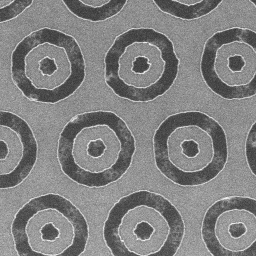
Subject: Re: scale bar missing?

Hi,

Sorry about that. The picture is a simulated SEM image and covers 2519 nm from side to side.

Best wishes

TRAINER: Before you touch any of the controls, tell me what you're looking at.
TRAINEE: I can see ring-shaped raised bodies with a dot in the middle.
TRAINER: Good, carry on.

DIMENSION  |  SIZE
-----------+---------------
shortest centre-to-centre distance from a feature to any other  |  94.1 pixels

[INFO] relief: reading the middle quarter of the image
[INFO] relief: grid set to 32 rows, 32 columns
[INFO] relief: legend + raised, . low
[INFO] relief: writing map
..+++.....++++...+++++...++++...
..+++.....++++...++++....++++...
..+++.....++++..........++++....
.++++.......++..........++++....
+++++.....+++++........++++.....
++++.......+++++++...++++++.....
+++.........++++++++++++++......
++...........++++++++++++.......
...............++++++++.........
................................
................................
................................
.....++++++++...............++++
..++++++++++++............++++++
.++++++++++++++..........+++++++
++++++++...+++++........+++++++.
+++++.......++++.......+++++....
++++.........++++......++++.....
+++..........+++++....++++......
+++...++++....++++....++++....++
++....++++....++++....++++...+++
++....++++....++++....++++....++
++....++++....+++......+++....++
+++..........++++......+++......
+++..........++++......++++.....
++++........++++.......+++++....
++++++....++++++........+++++...
+++++++++++++++..........+++++++
.+++++++++++++............++++++
...+++++++++...............+++++
......++++......................
................................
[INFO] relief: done